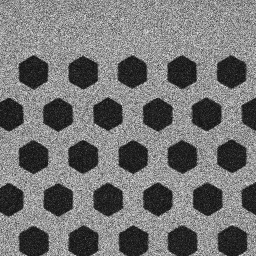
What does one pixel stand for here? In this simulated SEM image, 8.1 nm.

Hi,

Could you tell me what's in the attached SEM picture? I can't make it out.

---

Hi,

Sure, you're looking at a regular array of holes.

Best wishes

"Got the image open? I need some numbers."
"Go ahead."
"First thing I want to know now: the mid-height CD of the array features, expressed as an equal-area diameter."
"251 nanometers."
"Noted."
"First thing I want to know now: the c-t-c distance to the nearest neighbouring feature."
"397 nanometres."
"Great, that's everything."